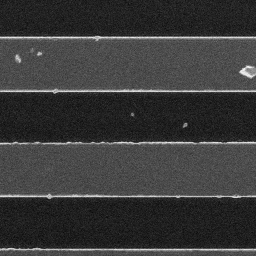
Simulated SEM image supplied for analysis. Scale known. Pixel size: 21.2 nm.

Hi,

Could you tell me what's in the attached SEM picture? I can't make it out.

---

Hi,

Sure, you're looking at lines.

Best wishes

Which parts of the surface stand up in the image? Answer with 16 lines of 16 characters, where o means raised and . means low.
................
................
oooooooooooooooo
oooooooooooooooo
oooooooooooooooo
oooooooooooooooo
................
................
................
oooooooooooooooo
oooooooooooooooo
oooooooooooooooo
................
................
................
................